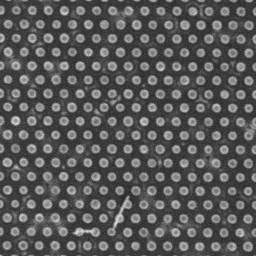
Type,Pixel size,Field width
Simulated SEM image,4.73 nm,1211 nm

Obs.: a regular array of raised bodies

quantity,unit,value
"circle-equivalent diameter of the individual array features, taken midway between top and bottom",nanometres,38.1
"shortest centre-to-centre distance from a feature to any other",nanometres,74.6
